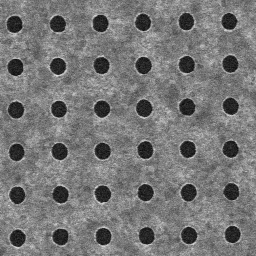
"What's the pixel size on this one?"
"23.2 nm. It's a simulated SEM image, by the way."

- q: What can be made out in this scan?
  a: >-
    a regular array of holes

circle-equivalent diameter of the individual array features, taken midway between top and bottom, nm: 405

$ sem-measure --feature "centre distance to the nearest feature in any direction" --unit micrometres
0.982